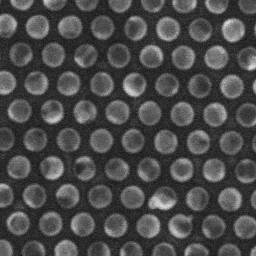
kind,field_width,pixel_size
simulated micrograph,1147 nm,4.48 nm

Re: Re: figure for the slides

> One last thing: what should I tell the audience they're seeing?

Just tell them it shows a regular array of raised bodies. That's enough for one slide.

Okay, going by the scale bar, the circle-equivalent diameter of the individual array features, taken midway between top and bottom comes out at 0.101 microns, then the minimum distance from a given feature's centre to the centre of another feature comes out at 32.1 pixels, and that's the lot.